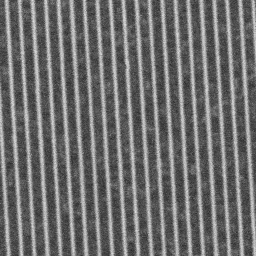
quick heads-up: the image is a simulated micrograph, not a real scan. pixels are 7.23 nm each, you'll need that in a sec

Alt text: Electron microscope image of parallel lines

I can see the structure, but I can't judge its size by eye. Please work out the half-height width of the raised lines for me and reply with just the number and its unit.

18 nm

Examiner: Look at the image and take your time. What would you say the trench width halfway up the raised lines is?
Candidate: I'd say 73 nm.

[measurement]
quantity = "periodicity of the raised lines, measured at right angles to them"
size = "93.6 nm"